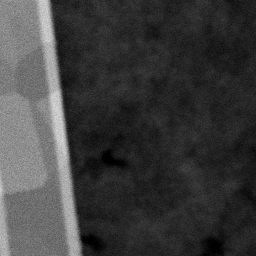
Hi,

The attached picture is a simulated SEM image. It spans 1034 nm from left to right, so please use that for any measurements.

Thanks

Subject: one or a few lines or trenches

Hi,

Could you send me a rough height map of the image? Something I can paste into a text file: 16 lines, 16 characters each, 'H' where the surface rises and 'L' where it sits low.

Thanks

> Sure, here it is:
HHHLLLLLLLLLLLLL
HHHLLLLLLLLLLLLL
HHHLLLLLLLLLLLLL
HHHLLLLLLLLLLLLL
HHHLLLLLLLLLLLLL
HHHLLLLLLLLLLLLL
HHHLLLLLLLLLLLLL
HHHHLLLLLLLLLLLL
HHHHLLLLLLLLLLLL
HHHHLLLLLLLLLLLL
HHHHLLLLLLLLLLLL
HHHHLLLLLLLLLLLL
HHHHLLLLLLLLLLLL
HHHHLLLLLLLLLLLL
HHHHLLLLLLLLLLLL
HHHHHLLLLLLLLLLL